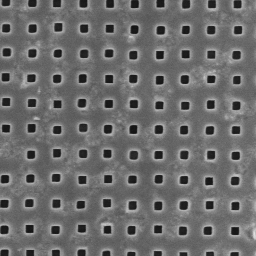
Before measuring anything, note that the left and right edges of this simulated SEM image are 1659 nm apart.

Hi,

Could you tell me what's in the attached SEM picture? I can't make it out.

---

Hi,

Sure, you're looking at a regular array of holes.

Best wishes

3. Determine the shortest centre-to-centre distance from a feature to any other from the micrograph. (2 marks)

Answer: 159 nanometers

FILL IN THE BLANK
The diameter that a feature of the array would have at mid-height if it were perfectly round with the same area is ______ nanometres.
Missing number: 58.5